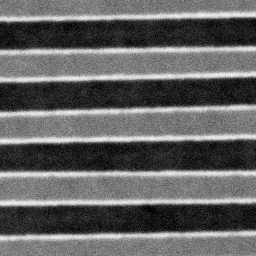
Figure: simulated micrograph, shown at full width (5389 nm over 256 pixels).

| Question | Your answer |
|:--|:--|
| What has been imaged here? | lines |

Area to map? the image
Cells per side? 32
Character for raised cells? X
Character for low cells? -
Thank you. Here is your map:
XXXXXXXXXXXXXXXXXXXXXXXXXXXXXXXX
XXXXXXXXXXXXXXXXXXXXXXXXXXXXXXXX
XXXXX---------------------------
--------------------------------
--------------------------------
--------------------------------
--XXXXXXXXXXXXXXXXXXXXXXXXXXXXXX
XXXXXXXXXXXXXXXXXXXXXXXXXXXXXXXX
XXXXXXXXXXXXXXXXXXXXXXXXXXXXXXXX
XXXXXXXXXXXXXXXXXXXXXXXXXXXXXXXX
--------------------------------
--------------------------------
--------------------------------
----------------------------XXXX
XXXXXXXXXXXXXXXXXXXXXXXXXXXXXXXX
XXXXXXXXXXXXXXXXXXXXXXXXXXXXXXXX
XXXXXXXXXXXXXXXXXXXXXXXXXXXXXXXX
XXXXXXXXXXXXX-X-----------------
--------------------------------
--------------------------------
--------------------------------
-----------------------------X--
XXXXXXXXXXXXXXXXXXXXXXXXXXXXXXXX
XXXXXXXXXXXXXXXXXXXXXXXXXXXXXXXX
XXXXXXXXXXXXXXXXXXXXXXXXXXXXXXXX
XXXX----------------------------
--------------------------------
--------------------------------
--------------------------------
----------XXXXXXXXXXXXXXXXXXXXXX
XXXXXXXXXXXXXXXXXXXXXXXXXXXXXXXX
XXXXXXXXXXXXXXXXXXXXXXXXXXXXXXXX